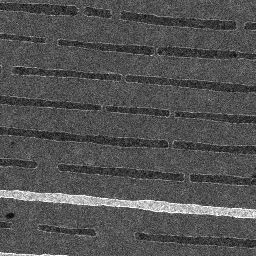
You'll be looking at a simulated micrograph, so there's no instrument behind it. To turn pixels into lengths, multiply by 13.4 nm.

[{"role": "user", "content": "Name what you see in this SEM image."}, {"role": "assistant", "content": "parallel lines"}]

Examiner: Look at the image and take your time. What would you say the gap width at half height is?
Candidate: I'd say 23.1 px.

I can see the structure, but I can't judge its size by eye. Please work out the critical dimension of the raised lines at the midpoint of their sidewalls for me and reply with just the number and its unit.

110 nm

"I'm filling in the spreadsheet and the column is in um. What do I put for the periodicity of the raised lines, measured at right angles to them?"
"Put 0.416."